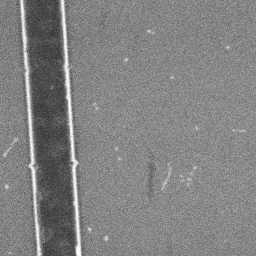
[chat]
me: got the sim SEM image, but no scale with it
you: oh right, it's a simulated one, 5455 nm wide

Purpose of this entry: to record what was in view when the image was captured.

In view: one or a few lines or trenches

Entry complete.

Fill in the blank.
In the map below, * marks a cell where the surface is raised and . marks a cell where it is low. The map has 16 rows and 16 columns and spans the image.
.***............
.***............
..**............
..**............
..**............
..**............
..**............
..**............
..***...........
..***...........
..***...........
..***...........
..***...........
..***...........
..***...........
..***...........